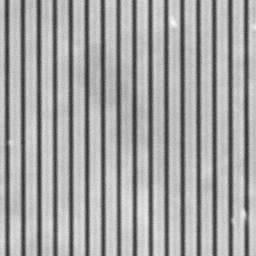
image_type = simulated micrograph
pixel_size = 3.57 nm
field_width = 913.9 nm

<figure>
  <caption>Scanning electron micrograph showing parallel lines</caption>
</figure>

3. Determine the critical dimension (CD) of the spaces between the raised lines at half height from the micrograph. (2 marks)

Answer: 4.51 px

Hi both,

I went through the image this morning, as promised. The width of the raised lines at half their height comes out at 42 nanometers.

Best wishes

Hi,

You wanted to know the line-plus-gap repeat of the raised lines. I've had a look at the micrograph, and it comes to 57 nanometres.